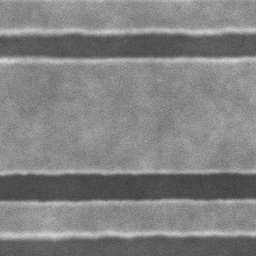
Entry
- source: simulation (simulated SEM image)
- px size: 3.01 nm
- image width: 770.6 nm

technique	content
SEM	lines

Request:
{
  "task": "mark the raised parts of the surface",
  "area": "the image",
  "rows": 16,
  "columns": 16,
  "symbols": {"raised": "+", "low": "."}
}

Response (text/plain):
++++++++++++++++
++++++++++++++++
................
................
++++++++++++++++
++++++++++++++++
++++++++++++++++
++++++++++++++++
++++++++++++++++
++++++++++++++++
++++++++++++++++
................
................
++++++++++++++++
++++++++++++++++
................